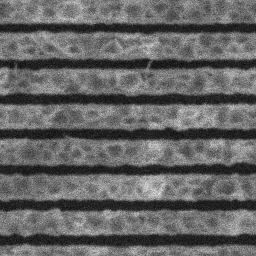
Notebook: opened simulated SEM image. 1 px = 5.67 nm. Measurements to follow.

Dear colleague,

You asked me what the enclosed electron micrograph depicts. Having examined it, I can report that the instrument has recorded parallel lines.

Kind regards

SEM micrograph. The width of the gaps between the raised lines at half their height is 72.3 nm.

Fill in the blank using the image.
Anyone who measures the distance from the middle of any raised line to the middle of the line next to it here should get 200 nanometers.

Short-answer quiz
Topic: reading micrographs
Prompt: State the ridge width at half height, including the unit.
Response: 129 nm